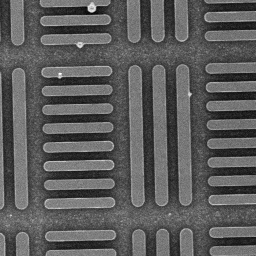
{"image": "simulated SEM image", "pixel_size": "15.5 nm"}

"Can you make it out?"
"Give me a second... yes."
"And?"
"groups of lines, slits or small figures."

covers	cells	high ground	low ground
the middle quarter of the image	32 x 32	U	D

DDDDDDDDDDDDDDDDDDDDDDDUDDDDDUUD
UUUUUUUUUUUUDDDDUUUDDDUUUDDDUUUD
UUUUUUUUUUUUDDDDUUUDDDUUUDDDUUUD
DDDDDDDDDDDDDDDDUUUDDDUUUDDDUUUD
DDDDDDDDDDDDDDDDUUUDDDUUUDDDUUUD
DDDDUUUUUUUDDDDDUUUDDDUUUDDDUUUD
UUUUUUUUUUUUDDDDUUUDDDUUUDDDUUUD
UUUUUUUUUUUDDDDDUUUDDDUUUDDDUUUU
DDDDDDDDDDDDDDDDUUUDDDUUUDDDUUUD
DDDDDDDDDDDDDDDDUUUDDDUUUDDDUUUD
UUUUUUUUUUUUDDDDUUUDDDUUUDDDUUUD
UUUUUUUUUUUUDDDDUUUDDDDUUDDDUUUD
UUUDDDDDDDDDDDDDUUUDDDDUUDDDUUUD
DDDDDDDDDDDDDDDDUUUUDDDUUDDDUUUD
DDDDDDDDDDDDDDDDDUUUDDDUUDDDUUUD
UUUUUUUUUUUUDDDDDUUUDDDUUDDDUUUD
UUUUUUUUUUUUDDDDDUUUDDDUUDDDUUUD
DDDDDDDDDDDDDDDDDUUUDDDUUDDDUUUU
DDDDDDDDDDDDDDDDDUUUDDDUUDDDDUUU
DDDDDDDUUUUUDDDDDUUUDDDUUDDDDUUU
UUUUUUUUUUUUDDDDDUUUDDDUUUDDDUUU
UUUUUUUUUUUUDDDDDUUUDDDUUUDDDUUU
DDDDDDDDDDDDDDDDDUUUDDDUUUDDDUUU
DDDDDDDDDDDDDDDDDUUUDDDUUUDDDUUU
UUUUUUUUUUUUDDDDDUUUDDDUUUDDDUUU
UUUUUUUUUUUUDDDDDUUUDDDUUUDDDUUU
UUUUUUDDDDDDDDDDDUUUDDDUUUDDDUUU
DDDDDDDDDDDDDDDDDUUUDDDUUUDDDUUU
DDDDDDDDDDDDDDDDDUUUDDDUUUDDDUUU
UUUUUUUUUUUUDDDDDUUUDDDUUUDDDUUU
UUUUUUUUUUUUDDDDDUUUDDDUUUDDDUUU
DDDDDDDDDDDDDDDDDUUUDDDUUUDDDUUU